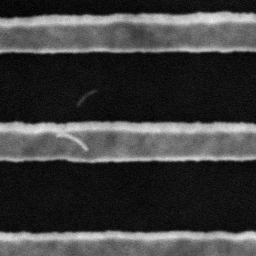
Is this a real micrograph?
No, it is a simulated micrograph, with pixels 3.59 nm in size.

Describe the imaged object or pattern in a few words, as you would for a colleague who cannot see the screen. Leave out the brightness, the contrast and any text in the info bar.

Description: lines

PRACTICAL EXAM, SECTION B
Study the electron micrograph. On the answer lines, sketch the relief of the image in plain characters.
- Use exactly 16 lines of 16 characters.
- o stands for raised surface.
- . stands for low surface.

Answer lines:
................
oooooooooooooooo
oooooooooooooooo
................
................
................
................
................
oooooooooooooooo
oooooooooooooooo
................
................
................
................
................
oooooooooooooooo